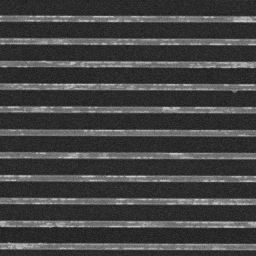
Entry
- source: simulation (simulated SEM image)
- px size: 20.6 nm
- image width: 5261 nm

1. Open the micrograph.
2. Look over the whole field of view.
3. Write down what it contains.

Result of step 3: parallel lines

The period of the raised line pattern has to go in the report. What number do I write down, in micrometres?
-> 0.468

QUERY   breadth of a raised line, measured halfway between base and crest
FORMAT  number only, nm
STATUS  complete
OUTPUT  113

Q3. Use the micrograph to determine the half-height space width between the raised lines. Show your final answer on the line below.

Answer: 357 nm